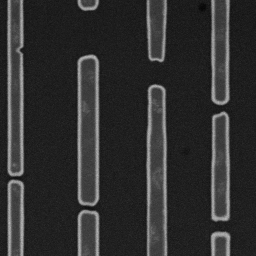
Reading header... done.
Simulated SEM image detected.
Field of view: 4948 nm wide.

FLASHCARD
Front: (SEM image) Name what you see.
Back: one or a few lines or trenches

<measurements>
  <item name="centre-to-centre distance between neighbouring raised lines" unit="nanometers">1330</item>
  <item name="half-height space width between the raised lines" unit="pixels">51.6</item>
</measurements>